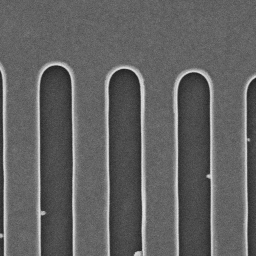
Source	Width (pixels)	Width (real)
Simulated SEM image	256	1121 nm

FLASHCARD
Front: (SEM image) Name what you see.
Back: groups of lines, slits or small figures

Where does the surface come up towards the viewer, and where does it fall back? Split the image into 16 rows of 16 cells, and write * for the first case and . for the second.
****************
****************
****************
****************
***.***.********
**...**..**..**.
**...**..**..**.
**...**..**..**.
**...**..**..**.
**...**..**..**.
**...**..**..**.
**...**..**..**.
**...**..**..**.
**...**..**..**.
**...**..**..**.
**...**..**..**.